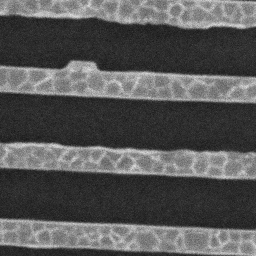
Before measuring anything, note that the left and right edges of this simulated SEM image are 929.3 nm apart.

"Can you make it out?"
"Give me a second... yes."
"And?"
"one or a few lines or trenches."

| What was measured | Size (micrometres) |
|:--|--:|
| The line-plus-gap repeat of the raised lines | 0.278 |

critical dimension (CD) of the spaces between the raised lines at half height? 51.9 pixels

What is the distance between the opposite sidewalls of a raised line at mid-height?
88.5 nanometers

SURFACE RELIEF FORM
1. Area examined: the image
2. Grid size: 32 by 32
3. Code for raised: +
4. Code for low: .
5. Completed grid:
++++++++++++++++++++++++++++++++
++++++++++++++++++++++++++++++++
.............+++++++++++++++++++
.......................+++......
................................
................................
................................
................................
+++.....++++....................
+++++++++++++++++++++++.........
++++++++++++++++++++++++++++++++
..++++++++++++++++++++++++++++++
........................+.++++++
................................
................................
................................
................................
................................
+++++++++.+++...................
++++++++++++++++++++++++++++++++
++++++++++++++++++++++++++++++++
..............++++++++++++++++++
................................
................................
................................
................................
................................
+...............................
+++++++++++++++++++++...........
++++++++++++++++++++++++++++++++
++++++++++++++++++++++++++++++++
......................++++++++++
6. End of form